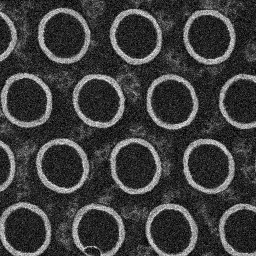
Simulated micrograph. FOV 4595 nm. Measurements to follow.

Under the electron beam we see a regular array of raised bodies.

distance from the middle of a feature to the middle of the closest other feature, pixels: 73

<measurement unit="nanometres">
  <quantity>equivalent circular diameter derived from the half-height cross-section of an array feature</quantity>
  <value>876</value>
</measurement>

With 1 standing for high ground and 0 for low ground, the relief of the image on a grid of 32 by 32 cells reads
00000000000000000000000000000000
00000001100000001100000000000000
10000011110000011110000011110000
11000111111000111111000111111000
11000111111000111111000111111000
11000111111000111111000111111000
10000011110000011110000011111000
00000001100000001100000001100000
00000000000000000000000000000000
00110000000000000000000000000000
01111000001111000001111000000111
01111100001111100001111100001111
11111100011111100001111100001111
01111100001111100001111110001111
01111100001111100001111100001111
00010000000111000000111000000111
00000000000000000000000000000000
00000000000000000000000000000000
10000011110000011110000011110000
10000111110000111111000111111000
11000111111000111111000111111000
11000111111000111111000111111000
10000111110000011110000011111000
00000001110000011110000001110000
00000000000000000000000000000000
00000000000000000000000000000000
01111000001111000001111000000111
11111100001111100001111100001111
11111100011111100001111100001111
11111100011111100001111100001111
01111100001111100001111100001111
00111000000011000000111000000111